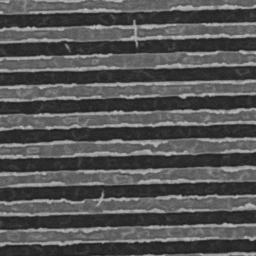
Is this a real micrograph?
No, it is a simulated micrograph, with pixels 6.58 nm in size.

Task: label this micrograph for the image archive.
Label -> parallel lines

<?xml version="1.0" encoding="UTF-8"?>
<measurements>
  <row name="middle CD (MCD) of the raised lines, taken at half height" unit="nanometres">98.6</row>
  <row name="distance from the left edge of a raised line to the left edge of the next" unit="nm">190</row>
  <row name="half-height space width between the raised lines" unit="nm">92.1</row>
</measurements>